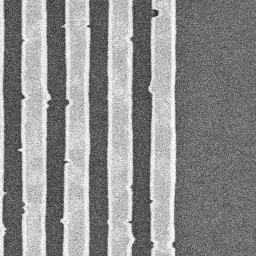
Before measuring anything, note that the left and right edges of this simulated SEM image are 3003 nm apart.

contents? parallel lines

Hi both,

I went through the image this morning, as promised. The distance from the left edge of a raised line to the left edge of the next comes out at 503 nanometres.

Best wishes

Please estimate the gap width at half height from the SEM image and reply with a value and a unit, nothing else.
265 nm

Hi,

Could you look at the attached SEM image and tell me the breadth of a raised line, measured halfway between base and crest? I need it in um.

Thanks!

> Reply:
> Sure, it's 0.246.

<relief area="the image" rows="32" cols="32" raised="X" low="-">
---XX---XXX---XX---XXX----------
---XX---XXX---XX----XX----------
---XX---XXX---XX---XXX----------
---XX---XXX---XX---XXX----------
---XX---XXX---XX---XXX----------
---XX----XX---XX---XXX----------
---XX----XX---XX---XXX----------
---XX----XX---XX---XXX----------
---XX----XX---XX---XXX----------
---XX----XX---XX---XXX----------
---XXX---XX---XX---XXX----------
---XXX---XX---XX---XXX----------
---XXX---XX---XX---XXX----------
---XXX---XX---XX---XXX----------
---XXX--XXX---XX---XXX----------
---XXX--XXX---XX---XXX----------
---XXX--XXX---XX---XXX----------
---XXX--XXX---XX---XXX----------
---XXX--XXX---XX---XXX----------
---XXX--XXX---XX---XXX----------
---XXX--XXX---XX---XXX----------
---XXX--XXX---XX---XXX----------
---XXX--XXX---XX---XXX----------
---XXX--XXX---XX---XXX----------
---XX---XXX---XX---XXX----------
---XX---XXX---XX---XX-----------
---XX---XXX---XX---XX-----------
---XX---XXX---XX---XX-----------
---XX---XXX---XX---XX-----------
---XX---XXX---XX---XXX----------
---XX---XXX---XX---XX-----------
---XX---XXX---XX---XXX----------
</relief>